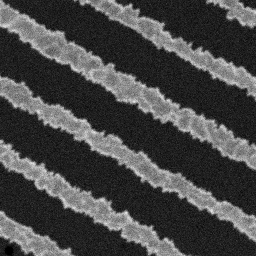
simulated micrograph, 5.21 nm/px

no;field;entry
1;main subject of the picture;one or a few lines or trenches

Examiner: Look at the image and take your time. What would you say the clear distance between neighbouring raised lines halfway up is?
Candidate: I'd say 221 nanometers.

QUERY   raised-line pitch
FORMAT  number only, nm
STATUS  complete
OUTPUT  315